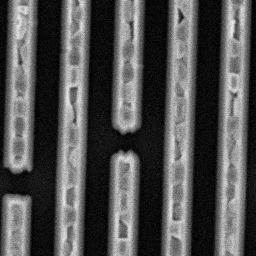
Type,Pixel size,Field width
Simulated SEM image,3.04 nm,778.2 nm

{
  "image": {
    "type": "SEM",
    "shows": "parallel lines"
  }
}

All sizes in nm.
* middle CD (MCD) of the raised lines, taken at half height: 67.1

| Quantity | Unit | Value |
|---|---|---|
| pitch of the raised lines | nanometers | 162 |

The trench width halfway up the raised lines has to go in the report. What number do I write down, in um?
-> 0.0952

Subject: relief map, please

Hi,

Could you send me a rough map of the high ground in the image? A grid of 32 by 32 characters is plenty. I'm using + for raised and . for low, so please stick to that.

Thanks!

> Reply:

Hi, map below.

..++....+++....+++....++....+++.
..++....+++....+++....++....+++.
.+++....+++....+++....++....+++.
.+++....+++....++.....++....+++.
.+++....+++....++....+++....+++.
.+++....+++....++....+++....+++.
.+++....+++....++....+++....+++.
.+++....+++....++....+++....+++.
.+++....+++....++....+++....+++.
.+++....+++....++....+++....+++.
.+++....+++....++....+++....+++.
.+++....+++....++....+++....+++.
.+++....+++....++....+++....+++.
.+++....+++....++....+++....+++.
.+++....++....+++....+++....+++.
.+++....++.....++....+++....++..
.+++....++...........+++....++..
.+++....++...........+++....++..
.+++....++...........+++....++..
.+++....++.....++....+++....++..
.++.....++....+++....+++....++..
........++....+++....+++....++..
........++....+++....+++....++..
........++....+++....+++....++..
........++....+++....+++....++..
.++....+++....+++....++.....++..
.++....+++....+++....++....+++..
.++....+++....+++....++....+++..
.++....+++....+++....++....+++..
.++....+++....+++....++....+++..
.++....+++....+++....++....+++..
.++....+++....+++....++....+++..